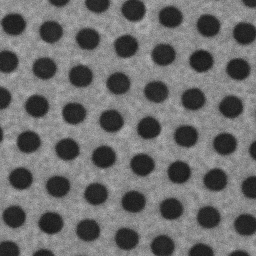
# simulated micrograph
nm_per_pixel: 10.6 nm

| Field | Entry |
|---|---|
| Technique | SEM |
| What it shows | a regular array of holes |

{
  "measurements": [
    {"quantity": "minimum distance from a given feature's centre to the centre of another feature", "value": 0.395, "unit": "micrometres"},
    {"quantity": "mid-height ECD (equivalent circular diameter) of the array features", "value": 0.253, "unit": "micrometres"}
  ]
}